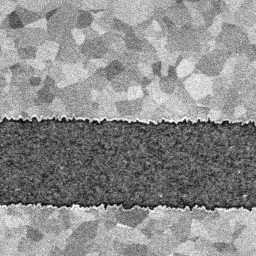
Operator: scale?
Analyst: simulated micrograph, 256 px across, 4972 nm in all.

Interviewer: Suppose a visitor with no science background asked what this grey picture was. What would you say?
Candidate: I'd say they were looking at one or a few lines or trenches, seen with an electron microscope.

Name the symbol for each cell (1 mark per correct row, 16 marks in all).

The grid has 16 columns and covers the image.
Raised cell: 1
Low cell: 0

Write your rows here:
1111111111111111
1111111111111111
1111111111111111
1111111111111111
1111111111111111
1111111111111111
1111111111111111
0000000011111111
0000000000000000
0000000000000000
0000000000000000
0000000000000000
0000000000000000
1111111111111111
1111111111111111
1111111111111111